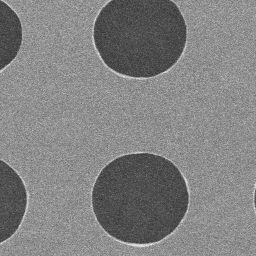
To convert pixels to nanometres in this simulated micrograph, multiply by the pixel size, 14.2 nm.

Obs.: holes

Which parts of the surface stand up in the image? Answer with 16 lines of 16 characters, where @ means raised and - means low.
-@@@@@-----@@@@@
-@@@@@------@@@@
-@@@@@------@@@@
-@@@@@-----@@@@@
@@@@@@@---@@@@@@
@@@@@@@@@@@@@@@@
@@@@@@@@@@@@@@@@
@@@@@@@@@@@@@@@@
@@@@@@@@@@@@@@@@
@@@@@@@@@@@@@@@@
-@@@@@@----@@@@@
-@@@@@------@@@@
--@@@@------@@@@
-@@@@@-----@@@@@
-@@@@@@----@@@@@
@@@@@@@@@@@@@@@@